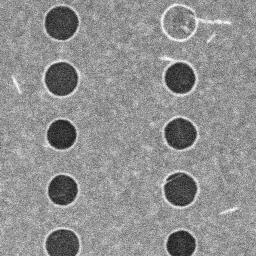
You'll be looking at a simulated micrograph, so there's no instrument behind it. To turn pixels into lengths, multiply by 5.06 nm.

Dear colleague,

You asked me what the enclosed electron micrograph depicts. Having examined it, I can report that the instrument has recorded holes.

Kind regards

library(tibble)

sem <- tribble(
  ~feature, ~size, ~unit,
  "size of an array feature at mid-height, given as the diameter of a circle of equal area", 32.6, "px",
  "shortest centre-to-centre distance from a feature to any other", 0.281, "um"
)